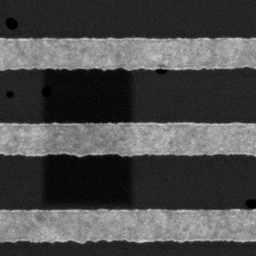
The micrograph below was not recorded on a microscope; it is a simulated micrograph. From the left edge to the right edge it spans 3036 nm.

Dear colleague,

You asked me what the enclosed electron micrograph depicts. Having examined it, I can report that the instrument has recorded lines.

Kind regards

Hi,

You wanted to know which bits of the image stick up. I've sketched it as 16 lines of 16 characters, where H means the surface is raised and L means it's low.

LLLLLLLLLLLLLLLL
LLLLLLLLLLLLLLLL
HHHHHHHHHHHHHHHH
HHHHHHHHHHHHHHHH
LLLLLLLLLLLLLLLL
LLLLLLLLLLLLLLLL
LLLLLLLLLLLLLLLL
LLLLLLLLLLLLLLLL
HHHHHHHHHHHHHHHH
HHHHHHHHHHHHHHHH
LLLLLLLLLLLLLLLL
LLLLLLLLLLLLLLLL
LLLLLLLLLLLLLLLL
HHHHHHHHHHHHHHHH
HHHHHHHHHHHHHHHH
LLLLLLLLLLLLLLLL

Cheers